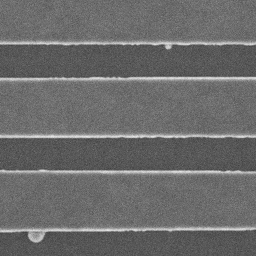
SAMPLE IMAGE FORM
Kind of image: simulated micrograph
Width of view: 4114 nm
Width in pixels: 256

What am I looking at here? lines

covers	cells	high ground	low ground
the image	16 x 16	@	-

@@@@@@@@@@@@@@@@
@@@@@@@@@@@@@@@@
@@@@@@@@@@@@@@@@
----------------
----------------
@@@@@@@@@@@@@@@@
@@@@@@@@@@@@@@@@
@@@@@@@@@@@@@@@@
@@@@@@@@@@@@@@@@
----------------
----------------
@@@@@@@@@@@@@@@@
@@@@@@@@@@@@@@@@
@@@@@@@@@@@@@@@@
--@-------------
----------------